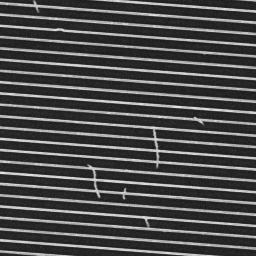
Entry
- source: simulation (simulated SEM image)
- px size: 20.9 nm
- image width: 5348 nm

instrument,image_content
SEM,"parallel lines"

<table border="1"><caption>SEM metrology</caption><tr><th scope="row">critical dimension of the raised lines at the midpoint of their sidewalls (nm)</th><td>36.4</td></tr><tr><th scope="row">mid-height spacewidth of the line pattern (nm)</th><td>193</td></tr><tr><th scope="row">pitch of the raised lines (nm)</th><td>235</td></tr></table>